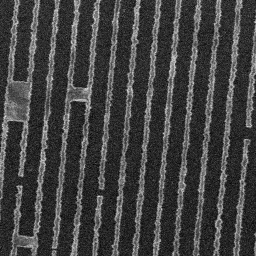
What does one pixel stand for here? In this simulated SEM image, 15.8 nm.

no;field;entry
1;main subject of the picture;parallel lines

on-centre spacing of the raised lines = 318 nm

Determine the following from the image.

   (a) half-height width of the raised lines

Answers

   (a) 57.1 nm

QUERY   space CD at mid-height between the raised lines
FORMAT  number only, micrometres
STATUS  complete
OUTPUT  0.26